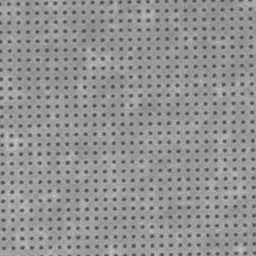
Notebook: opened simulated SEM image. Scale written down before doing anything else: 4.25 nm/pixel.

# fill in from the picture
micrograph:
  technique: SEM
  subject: a regular array of holes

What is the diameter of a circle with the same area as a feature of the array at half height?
0.0179 um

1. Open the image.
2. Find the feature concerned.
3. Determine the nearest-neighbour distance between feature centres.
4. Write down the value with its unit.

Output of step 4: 37.6 nm